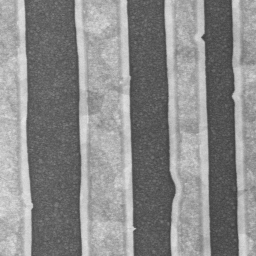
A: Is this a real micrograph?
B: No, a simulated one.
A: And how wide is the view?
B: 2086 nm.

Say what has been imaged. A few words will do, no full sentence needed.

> one or a few lines or trenches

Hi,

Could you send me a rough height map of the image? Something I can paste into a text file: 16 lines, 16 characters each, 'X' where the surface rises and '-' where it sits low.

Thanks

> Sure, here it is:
X----XXX---X---X
X----XXX---XX--X
X----XXX---XX--X
X----XXX---XX--X
X----XXX---XX--X
X----XXX---XX--X
X----XXX---XX--X
X----XXX---XX--X
X----XXX---XX--X
X----XXX---XX--X
X----XXX---XX--X
XX---XXX---XX--X
XX---XXX---XX--X
XX---XXX---XX--X
XX---XXX---XX--X
XX---XXX---XX--X